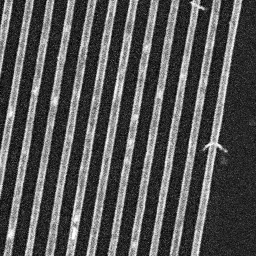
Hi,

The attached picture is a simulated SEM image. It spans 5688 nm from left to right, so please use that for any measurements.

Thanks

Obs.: parallel lines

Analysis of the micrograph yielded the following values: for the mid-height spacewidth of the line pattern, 13.7 px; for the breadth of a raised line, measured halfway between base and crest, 151 nm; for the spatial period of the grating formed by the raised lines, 456 nanometres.